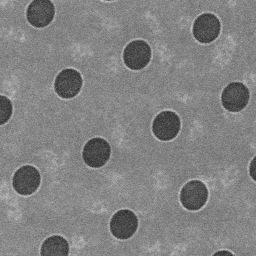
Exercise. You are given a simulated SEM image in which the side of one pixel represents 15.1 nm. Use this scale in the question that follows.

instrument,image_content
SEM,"a regular array of holes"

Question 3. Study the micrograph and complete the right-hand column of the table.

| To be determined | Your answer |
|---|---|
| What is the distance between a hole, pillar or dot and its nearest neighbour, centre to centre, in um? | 1.12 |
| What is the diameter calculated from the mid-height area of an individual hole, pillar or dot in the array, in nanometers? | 458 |